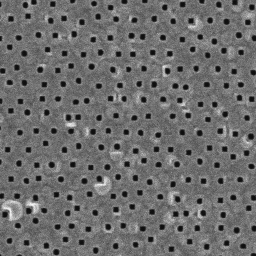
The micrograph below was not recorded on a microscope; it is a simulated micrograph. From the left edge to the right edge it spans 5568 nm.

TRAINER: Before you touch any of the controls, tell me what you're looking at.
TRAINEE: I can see a regular array of holes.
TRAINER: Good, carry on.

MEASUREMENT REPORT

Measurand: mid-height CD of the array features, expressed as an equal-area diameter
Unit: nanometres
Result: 139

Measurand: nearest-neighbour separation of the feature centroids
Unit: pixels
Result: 14.8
